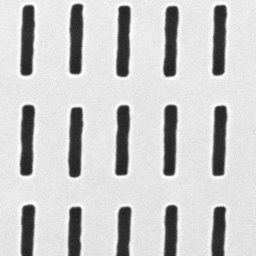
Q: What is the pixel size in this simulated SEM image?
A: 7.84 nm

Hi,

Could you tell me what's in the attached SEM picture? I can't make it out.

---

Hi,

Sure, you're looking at a regular array of holes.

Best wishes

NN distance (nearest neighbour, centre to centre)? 374 nm